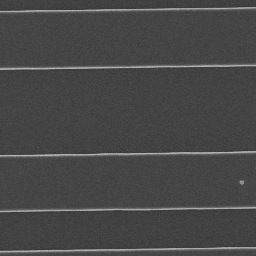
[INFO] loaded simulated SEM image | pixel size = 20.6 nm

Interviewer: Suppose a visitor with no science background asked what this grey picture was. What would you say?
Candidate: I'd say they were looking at groups of lines, slits or small figures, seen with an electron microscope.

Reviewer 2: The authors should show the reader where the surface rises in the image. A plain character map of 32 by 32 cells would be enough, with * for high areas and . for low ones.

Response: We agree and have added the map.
................................
********************************
********************************
********************************
********************************
********************************
********************************
********************************
*********.......................
................................
................................
................................
................................
................................
................................
................................
................................
................................
................................
********************************
********************************
********************************
********************************
********************************
********************************
********************************
................................
................................
................................
................................
................................
********************************